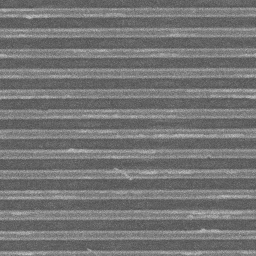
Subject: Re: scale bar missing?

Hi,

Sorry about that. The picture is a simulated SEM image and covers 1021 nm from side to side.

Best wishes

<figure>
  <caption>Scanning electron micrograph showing parallel lines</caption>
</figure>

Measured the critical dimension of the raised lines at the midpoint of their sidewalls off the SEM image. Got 32.4 nm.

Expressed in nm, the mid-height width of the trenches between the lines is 46.9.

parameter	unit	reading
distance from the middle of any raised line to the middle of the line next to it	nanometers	80.6